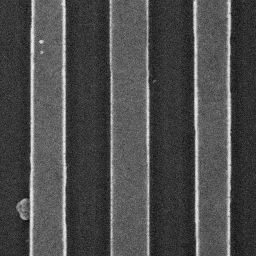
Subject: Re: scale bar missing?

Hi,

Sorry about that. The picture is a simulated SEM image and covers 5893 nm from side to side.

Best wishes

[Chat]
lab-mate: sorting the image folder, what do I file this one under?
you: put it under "lines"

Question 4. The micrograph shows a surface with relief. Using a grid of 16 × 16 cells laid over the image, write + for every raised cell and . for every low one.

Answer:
..++...++...++..
..++...++...++..
..++...++...++..
..++...++...++..
..++...++...++..
..++...++...++..
..++...++...++..
..++...++...++..
..++...++...++..
..++...++...++..
..++...++...++..
..++...++...++..
..++...++...++..
..++...++...++..
..++...++...++..
..++...++...++..